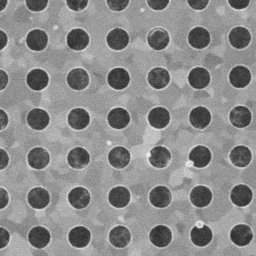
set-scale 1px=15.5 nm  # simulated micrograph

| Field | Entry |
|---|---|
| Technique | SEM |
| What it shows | a regular array of holes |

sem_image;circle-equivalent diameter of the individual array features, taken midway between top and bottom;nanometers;363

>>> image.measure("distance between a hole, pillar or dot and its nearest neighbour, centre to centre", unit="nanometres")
609